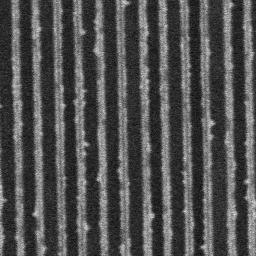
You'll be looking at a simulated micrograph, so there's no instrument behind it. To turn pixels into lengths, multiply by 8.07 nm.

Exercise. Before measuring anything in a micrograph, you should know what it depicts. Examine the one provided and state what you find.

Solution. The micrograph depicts parallel lines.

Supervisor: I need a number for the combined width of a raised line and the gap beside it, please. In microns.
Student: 0.17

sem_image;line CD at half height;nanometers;65.5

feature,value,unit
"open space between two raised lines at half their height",0.109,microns